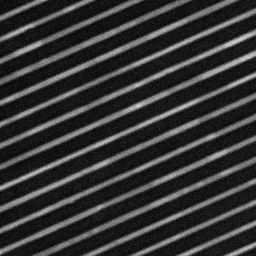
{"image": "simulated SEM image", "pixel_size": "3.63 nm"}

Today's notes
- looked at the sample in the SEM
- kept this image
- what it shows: parallel lines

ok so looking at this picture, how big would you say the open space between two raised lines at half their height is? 56.4 nanometres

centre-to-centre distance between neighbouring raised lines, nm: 70.4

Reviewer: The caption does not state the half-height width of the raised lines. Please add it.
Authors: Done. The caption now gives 0.0132 microns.